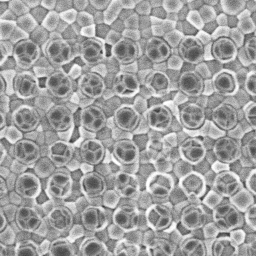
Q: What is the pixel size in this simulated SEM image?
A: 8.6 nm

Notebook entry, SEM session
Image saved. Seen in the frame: a regular array of raised bodies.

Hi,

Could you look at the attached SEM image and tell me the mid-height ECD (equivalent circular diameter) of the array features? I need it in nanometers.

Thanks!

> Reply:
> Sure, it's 188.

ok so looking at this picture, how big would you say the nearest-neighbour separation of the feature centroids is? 251 nm